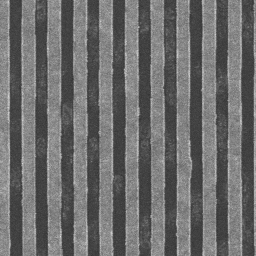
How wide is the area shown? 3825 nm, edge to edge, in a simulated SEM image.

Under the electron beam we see parallel lines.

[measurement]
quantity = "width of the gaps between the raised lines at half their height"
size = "190 nanometers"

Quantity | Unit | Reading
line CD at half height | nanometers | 190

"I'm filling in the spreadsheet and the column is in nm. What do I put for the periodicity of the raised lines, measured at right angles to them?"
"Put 385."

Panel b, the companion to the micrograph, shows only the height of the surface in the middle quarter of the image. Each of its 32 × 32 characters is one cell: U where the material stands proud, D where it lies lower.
DDUUUUDDDUUUDDDUUUDDDDUUUDDDUUUD
DDDUUUDDDUUUDDDUUUDDDDUUUDDDUUUD
DDDUUUDDDUUUDDDUUUDDDDUUUDDDUUUD
DDDUUUDDDUUUDDDUUUDDDDUUUDDDUUUD
DDDUUUDDDUUUDDDUUUDDDDUUUDDDUUUD
DDDUUUDDDUUUDDDDUUDDDDUUUDDDUUUD
DDDUUUDDDUUUDDDDUUDDDDUUUDDDUUUD
DDDUUUDDDUUUDDDDUUDDDDUUUDDDUUUD
DDDUUUDDDUUUDDDDUUDDDDUUUDDDUUUD
DDDUUUDDDUUUDDDDUUDDDDUUUDDDUUUD
DDDUUUDDDUUUDDDDUUUDDDUUUDDDUUUD
UUDUUUDDDUUUDDDDUUUDDDUUUDDDUUUD
DUDUUUDDDUUUDDDDUUUDDDUUUDDDDUUD
DDDUUUDDDUUUDDDDUUUDDDUUUDDDDUUD
DDDUUUDDDUUUDDDDUUUDDDUUUDDDDUUD
DDDUUUDDDUUUDDDDUUUDDDUUUDDDUUUD
DDUUUUDDDUUUDDDUUUUDDDUUUDDDUUUD
DDDUUUDDDUUUDDDUUUDDDDUUUDDDUUUD
DDDUUUDDDUUUDDDDUUUDDDUUUDDDUUUD
DDDUUUDDDUUUDDDDUUUDDDUUUDDDUUUD
DDDUUUDDDUUUDDDDUUDDDDUUUDDDUUUD
DDDUUUDDDUUUDDDDUUDDDDUUUDDDUUUD
DDDUUUDDDUUUDDDDUUDDDDUUUDDDDUUD
DDDUUUDDDUUUDDDDUUDDDDUUUDDDUUUD
DDDUUUDDDUUUDDDDUUDDDDUUUDDDDUUU
DDDUUUDDDUUUDDDDUUDDDDUUUDDDDUUU
DDDUUUDDDUUUDDDDUUDDDDUUUDDDDUUU
DDDUUUDDDUUUDDDDUUDDDDUUUDDDDUUD
DDDUUUDDDUUUDDDDUUDDDDUUUDDDDUUD
DDUUUUDDDUUUDDDDUUDDDDUUUDDDDUUD
DDDUUUDDDUUUDDDDUUUDDDUUUDDDDUUD
DDDUUUDDDUUUDDDDUUDDDDUUUDDDDUUD